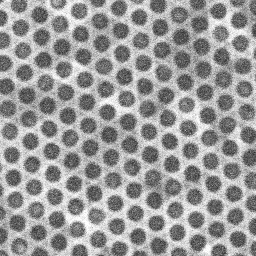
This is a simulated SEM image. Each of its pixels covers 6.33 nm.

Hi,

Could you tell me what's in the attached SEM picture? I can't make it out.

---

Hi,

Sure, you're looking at a regular array of holes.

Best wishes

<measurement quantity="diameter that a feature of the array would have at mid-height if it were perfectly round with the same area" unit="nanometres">118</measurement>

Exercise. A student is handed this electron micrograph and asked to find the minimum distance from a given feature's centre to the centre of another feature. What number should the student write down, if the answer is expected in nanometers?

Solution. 142